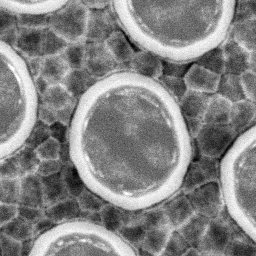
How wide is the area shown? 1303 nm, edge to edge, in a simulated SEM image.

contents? raised bodies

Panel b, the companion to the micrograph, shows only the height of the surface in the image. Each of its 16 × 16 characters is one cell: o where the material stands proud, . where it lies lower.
.oo.....oooooo..
........oooooo..
.........oooo...
o...............
oo..............
oo....oooo......
oo...oooooo.....
oo...oooooo.....
o....oooooo.....
.....ooooooo...o
.....oooooo...oo
......ooooo...oo
.......oo.....oo
...............o
....oo..........
..oooooo........